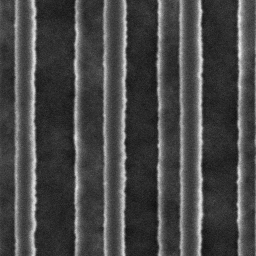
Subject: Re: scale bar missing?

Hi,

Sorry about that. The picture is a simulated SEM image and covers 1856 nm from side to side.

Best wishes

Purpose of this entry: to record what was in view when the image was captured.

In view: lines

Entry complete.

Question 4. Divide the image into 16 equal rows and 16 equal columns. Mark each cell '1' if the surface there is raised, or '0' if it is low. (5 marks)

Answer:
1100011100111001
1100011100111001
1100011100111001
1100011100111001
1100011100111001
1100011100111001
1100011100111001
1100011100111001
1100011100111001
1100011100111001
1100011100111001
1100011100111001
1100011100111001
1100011100111001
1100011100111001
1100011100111001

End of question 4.